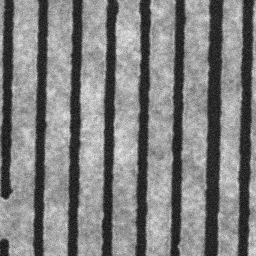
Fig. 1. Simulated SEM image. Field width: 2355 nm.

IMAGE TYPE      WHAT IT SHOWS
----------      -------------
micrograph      parallel lines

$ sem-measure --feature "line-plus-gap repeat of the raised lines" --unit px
34.4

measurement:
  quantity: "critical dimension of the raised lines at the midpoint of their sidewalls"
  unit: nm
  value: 215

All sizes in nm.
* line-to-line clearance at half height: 98.9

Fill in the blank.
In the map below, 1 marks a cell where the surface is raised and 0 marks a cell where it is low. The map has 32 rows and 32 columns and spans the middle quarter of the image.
11000111110001111110011111100011
11001111110001111110011111100011
11001111110001111110001111100011
11001111110001111110001111100011
11001111110001111110001111100011
11001111110001111110001111100011
11001111110001111110001111100011
11001111110001111110001111100011
10001111110001111110011111100011
10001111110001111110011111100011
10001111110001111110011111100011
10001111110001111110011111100011
10001111110001111100011111100011
11001111110001111100011111100011
10000111110001111110011111100011
10001111110001111110011111100011
10001111110001111110011111100011
11001111110001111100011111100011
10001111110001111100011111100011
10001111110001111100011111100011
10001111110001111100011111100011
10001111110001111100011111100011
10001111110001111100011111100011
10001111110001111100011111100111
10001111110001111100011111100011
10001111110011111100011111100011
10001111110011111100011111100011
10001111110011111100011111100011
10001111110001111100011111100011
10001111110011111100011111000011
10001111110011111100011111100011
10001111110011111100011111100011